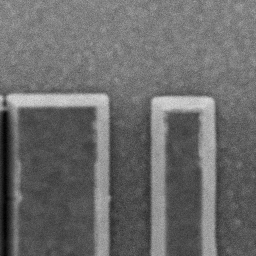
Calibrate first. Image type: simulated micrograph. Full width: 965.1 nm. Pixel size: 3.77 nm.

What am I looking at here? one or a few lines or trenches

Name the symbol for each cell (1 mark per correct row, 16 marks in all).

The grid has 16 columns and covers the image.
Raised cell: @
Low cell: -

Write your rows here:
----------------
----------------
----------------
----------------
----------------
----------------
-@@@@@----@@@---
-@@@@@----@@@---
-@@@@@----@@@---
-@@@@@----@@@---
-@@@@@----@@@---
-@@@@@----@@@---
-@@@@@----@@@---
-@@@@@----@@@---
-@@@@@----@@@---
-@@@@@----@@@---